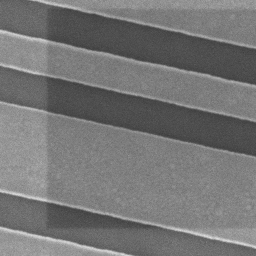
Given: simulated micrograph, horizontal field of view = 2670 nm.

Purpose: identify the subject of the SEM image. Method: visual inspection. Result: lines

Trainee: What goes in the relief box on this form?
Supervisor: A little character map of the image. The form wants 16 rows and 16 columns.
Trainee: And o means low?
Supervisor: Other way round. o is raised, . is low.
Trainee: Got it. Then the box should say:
....oooooooooooo
.........ooooooo
ooo..........ooo
ooooooo.........
..oooooooooo....
......oooooooooo
o..........ooooo
ooooo...........
oooooooooo......
oooooooooooooo..
oooooooooooooooo
oooooooooooooooo
...ooooooooooooo
.......ooooooooo
o...........oooo
oooooo..........